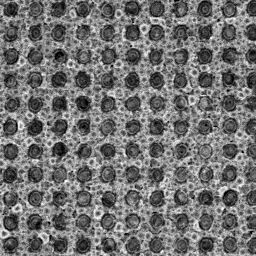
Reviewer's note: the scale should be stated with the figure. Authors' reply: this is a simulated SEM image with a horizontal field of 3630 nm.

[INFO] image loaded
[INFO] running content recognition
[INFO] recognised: a regular array of raised bodies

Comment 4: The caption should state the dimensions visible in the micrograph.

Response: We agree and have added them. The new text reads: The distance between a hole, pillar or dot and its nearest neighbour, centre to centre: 274 nm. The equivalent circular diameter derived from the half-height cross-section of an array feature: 165 nanometres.